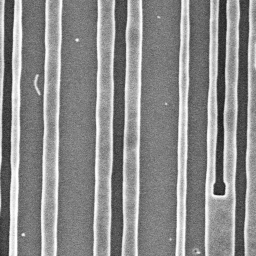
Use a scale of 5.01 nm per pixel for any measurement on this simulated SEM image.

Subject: groups of lines, slits or small figures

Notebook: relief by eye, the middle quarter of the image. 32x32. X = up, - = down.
---------XXX----XXX----------XX-
---------XXX----XXX----------XX-
---------XXX----XXX----------XX-
---------XXX----XXX----------XX-
---------XXX---XXXX----------XX-
---------XXX---XXXX----------XX-
---------XXX---XXXX----------XX-
---------XXX---XXXX----------XX-
--------XXXX---XXXX----------XX-
--------XXXX---XXXX----------XX-
--------XXXX---XXXX----------XX-
--------XXXX---XXXX----------XX-
--------XXXX---XXXX----------XX-
--------XXXX---XXXX----------XX-
--------XXXX---XXXX----------XX-
--------XXXX---XXXX----------XX-
--------XXXX---XXXX----------XX-
--------XXXX---XXXX----------XX-
--------XXXX---XXXX----------XX-
--------XXXX---XXXX----------XX-
--------XXXX---XXXX----------XX-
--------XXXX---XXXX----------XX-
--------XXXX---XXXX----------XX-
--------XXXX---XXXX----------XX-
--------XXXX---XXXX----------XX-
--------XXXX---XXXX----------XX-
--------XXXX---XXXX----------X--
--------XXXX---XXXX----------X--
--------XXX----XXXX----------X--
--------XXX----XXXX----------X--
--------XXX----XXXX----------X--
--------XXX----XXXX---------XX--